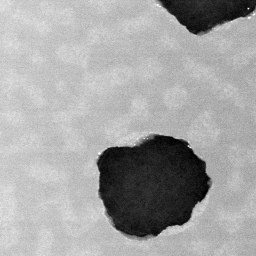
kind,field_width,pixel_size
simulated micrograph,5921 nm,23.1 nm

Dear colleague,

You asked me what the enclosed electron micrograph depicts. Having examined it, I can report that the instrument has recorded holes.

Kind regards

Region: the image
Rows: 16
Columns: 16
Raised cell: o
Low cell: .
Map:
oooooooooo......
ooooooooooo...oo
oooooooooooooooo
oooooooooooooooo
oooooooooooooooo
oooooooooooooooo
oooooooooooooooo
oooooooooooooooo
ooooooooo.oooooo
oooooo......oooo
oooooo.......ooo
oooooo.......ooo
oooooo.......ooo
ooooooo.....oooo
oooooooo..oooooo
oooooooooooooooo